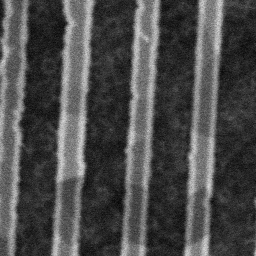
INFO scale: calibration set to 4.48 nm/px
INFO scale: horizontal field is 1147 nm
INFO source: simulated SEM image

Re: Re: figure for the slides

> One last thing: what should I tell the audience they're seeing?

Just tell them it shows one or a few lines or trenches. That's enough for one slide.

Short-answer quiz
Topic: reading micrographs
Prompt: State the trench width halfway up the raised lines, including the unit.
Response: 0.206 microns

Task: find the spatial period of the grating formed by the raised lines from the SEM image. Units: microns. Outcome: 0.291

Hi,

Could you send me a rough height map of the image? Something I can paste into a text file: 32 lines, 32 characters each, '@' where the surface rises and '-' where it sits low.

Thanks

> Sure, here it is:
-@@-----@@@-------@@-----@@-----
-@@-----@@@------@@------@@-----
-@@------@@------@@------@@-----
-@@------@@------@@------@@-----
-@@-----@@@------@@------@@-----
@@@-----@@@------@@------@@-----
-@@-----@@@------@@------@@-----
@@@-----@@@------@@------@@-----
@@@-----@@@------@@------@@-----
@@@-----@@@------@@------@@-----
-@@-----@@@------@@------@@-----
@@@-----@@@------@@------@@-----
@@@-----@@-------@@------@@-----
@@@-----@@-------@@------@@-----
@@------@@-------@@-----@@@-----
@@------@@-------@@-----@@@-----
@@------@@------@@@-----@@------
@@------@@------@@@-----@@------
@@------@@------@@------@@------
@@------@@------@@------@@------
@@------@@------@@------@@------
@@-----@@@------@@------@@------
@@-----@@@------@@------@@------
@@-----@@@------@@------@@------
@@-----@@@------@@------@@------
@@-----@@@------@@------@@------
@@-----@@@------@@------@@------
@@-----@@@------@@------@@------
@@-----@@@------@@------@@------
@@-----@@-------@@-----@@@------
@------@@-------@@-----@@@------
@------@@-------@@-----@@@------